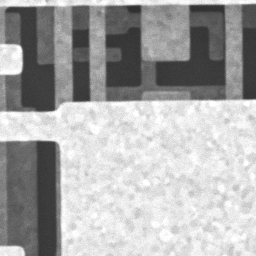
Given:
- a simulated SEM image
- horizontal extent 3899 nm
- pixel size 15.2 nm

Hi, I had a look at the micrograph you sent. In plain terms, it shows wiring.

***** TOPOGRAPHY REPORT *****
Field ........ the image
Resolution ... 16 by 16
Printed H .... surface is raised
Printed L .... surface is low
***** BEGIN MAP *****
LLLLLLLLLLLLLLLL
LLLLLLLLLLLLLLLL
LLLLLLLLLLLLLLLL
HLLLLLLLLLLLLLLL
HLLLLLLLLLLLLLLL
LLLLLLLLLLLLLLLL
LLLLHHHHHHHHHHHH
HHHHHHHHHHHHHHHH
HHHHHHHHHHHHHHHH
LLLLHHHHHHHHHHHH
LLLLHHHHHHHHHHHH
LLLLHHHHHHHHHHHH
LLLLHHHHHHHHHHHH
LLLLHHHHHHHHHHHH
LLLLHHHHHHHHHHHH
HLLLHHHHHHHHHHHH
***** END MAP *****